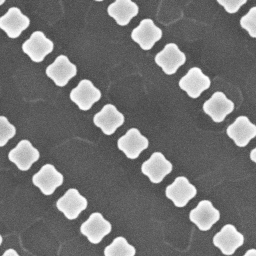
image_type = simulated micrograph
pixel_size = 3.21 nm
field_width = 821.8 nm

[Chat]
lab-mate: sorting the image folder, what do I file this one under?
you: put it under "a regular array of raised bodies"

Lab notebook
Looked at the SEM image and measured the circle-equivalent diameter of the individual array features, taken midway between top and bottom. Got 86.1 nm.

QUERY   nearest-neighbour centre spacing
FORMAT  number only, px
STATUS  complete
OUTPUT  33.9